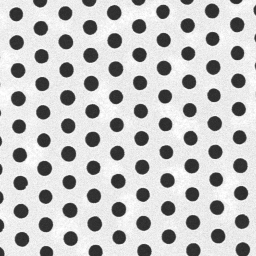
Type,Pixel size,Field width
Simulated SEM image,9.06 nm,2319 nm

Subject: a regular array of holes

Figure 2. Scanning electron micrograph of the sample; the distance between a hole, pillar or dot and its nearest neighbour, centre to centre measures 252 nm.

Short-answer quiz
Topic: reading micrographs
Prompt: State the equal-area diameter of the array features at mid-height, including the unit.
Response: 134 nm